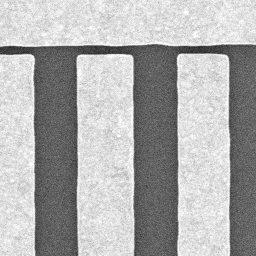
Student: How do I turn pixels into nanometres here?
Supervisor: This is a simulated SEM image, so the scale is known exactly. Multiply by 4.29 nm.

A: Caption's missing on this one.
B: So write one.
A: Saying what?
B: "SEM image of wiring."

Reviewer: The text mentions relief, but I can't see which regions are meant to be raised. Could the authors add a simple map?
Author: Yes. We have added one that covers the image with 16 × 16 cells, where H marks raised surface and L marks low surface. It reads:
HHHHHHHHHHHHHHHH
HHHHHHHHHHHHHHHH
HHHHHHHHHHHHHHHH
HHLLLHHHLLLHHHLL
HHLLLHHHLLLHHHLL
HHLLLHHHLLLHHHLL
HHLLLHHHLLLHHHLL
HHLLLHHHLLLHHHLL
HHLLLHHHLLLHHHLL
HHLLLHHHLLLHHHLL
HHLLLHHHLLLHHHLL
HHLLLHHHLLLHHHLL
HHLLLHHHLLLHHHLL
HHLLLHHHLLLHHHLL
HHLLLHHHLLLHHHLL
HHLLLHHHLLLHHHLL